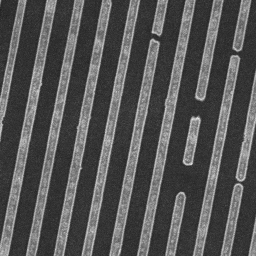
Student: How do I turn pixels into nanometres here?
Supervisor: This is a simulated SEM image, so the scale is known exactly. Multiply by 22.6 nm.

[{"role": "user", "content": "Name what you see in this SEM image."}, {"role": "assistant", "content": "parallel lines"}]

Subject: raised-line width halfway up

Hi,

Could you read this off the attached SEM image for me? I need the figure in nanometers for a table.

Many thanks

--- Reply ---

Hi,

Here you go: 192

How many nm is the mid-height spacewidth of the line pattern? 425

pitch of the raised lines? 620 nm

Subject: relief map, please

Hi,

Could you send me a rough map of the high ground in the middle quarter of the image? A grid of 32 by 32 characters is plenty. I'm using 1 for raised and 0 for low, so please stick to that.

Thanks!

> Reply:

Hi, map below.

11000001100000110000011000001100
11000011100001110000110000011000
10000011000001100000110000011000
10000011000001100000110000011000
10000011000001100000110000011000
10000011000001100000110000011000
10000011000011100001110000110000
00000110000011000001110000110000
00000110000011000001100000110000
00000110000011000001100000110000
00000110000011000001100000110000
00001110000011000011100001110000
00001100000110000011100001100000
00001100000110000011000001100000
00001100000110000011000001100000
00001100000110000011000001100000
00001100000110000011000011100001
00011100001100000110000011000001
00011000001100000110000011000001
00011000001100000110000011000001
00011000001100000110000011000001
00011000001000000110000011000011
00011000011000001100000110000011
00110000011000001100000110000011
00110000011000001100000110000011
00110000011000001100000110000000
00110000011000001100000110000000
00110000011000011100001100000000
01100000110000011000001100000000
01100000110000011000001100000000
01100000110000011000001100000000
01100000110000011000001100000000